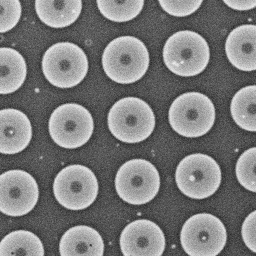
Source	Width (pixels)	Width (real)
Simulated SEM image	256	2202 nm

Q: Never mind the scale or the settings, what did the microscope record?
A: an array of small figures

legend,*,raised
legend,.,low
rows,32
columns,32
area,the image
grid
**..******..******..*****...****
***..*****...****....***........
**...****.....**................
*.............................**
.....................****....***
.......**.....****...*****..****
**....****...*****..******..****
***..******..******..*****...***
***..******..*****...*****....**
***...*****...****..............
***....***......................
*.............................**
...............***....****...***
.......***....*****..******..***
***...*****...*****..******..***
****..******..*****..******...**
****..******..*****...****......
****...****....***..............
***.............................
........................**....**
................***...*****...**
.**.....***....*****..******..**
****...*****..******..******..**
*****..*****...*****..*****....*
*****..*****...****.....**......
****....***......*..............
***.............................
........................***....*
.........**.....****...*****..**
.***....****...*****...*****..**
*****...*****..******..*****...*
*****...*****..*****...****.....